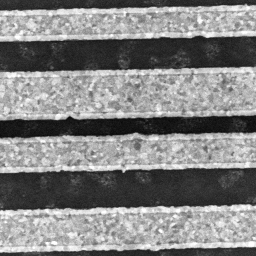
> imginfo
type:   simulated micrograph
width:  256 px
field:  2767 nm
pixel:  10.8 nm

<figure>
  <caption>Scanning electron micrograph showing one or a few lines or trenches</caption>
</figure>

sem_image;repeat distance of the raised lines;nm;740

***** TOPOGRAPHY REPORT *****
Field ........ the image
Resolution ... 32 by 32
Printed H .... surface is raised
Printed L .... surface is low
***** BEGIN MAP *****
LLLLLLLLLLLLLLLLLLLLLLLLLLLLLLLL
LLLLHLLLHHHHHHHHHHHHHHHHHHHHHHHH
HHHHHHHHHHHHHHHHHHHHHHHHHHHHHHHH
HHHHHHHHHHHHHHHHHHHHHHHHHHHHHHHH
HHHHHHHHHHHHHHHHHHLLLLLLLLLLLLLL
LLLLLLLLLLLLLLLLLLLLLLLLLLLLLLLL
LLLLLLLLLLLLLLLLLLLLLLLLLLLLLLLL
LLLLLLLLLLLLLLLLLLLLLLLLLLLLLLLL
LLLLLLLLLLLLLLLLLLLLLLLLLLLLLLLL
HHHHHHHHHHHHHHHHHHHHHHHHHHHHHHHH
HHHHHHHHHHHHHHHHHHHHHHHHHHHHHHHH
HHHHHHHHHHHHHHHHHHHHHHHHHHHHHHHH
HHHHHHHHHHHHHHHHHHHHHHHHHHHHHHHH
HHHHHHHHHHHHHHHHHHHHHHHHHHHHHHHH
HHHHHHHHLHHHHLLLLLLLLLLLLLLLLLLL
LLLLLLLLLLLLLLLLLLLLLLLLLLLLLLLL
LLLLLLLLLLLLLLLLLLLLLLLLLLLLLLLL
LLLLHHHHHHHHHHHHHHHHHHHHHHHHHHHH
HHHHHHHHHHHHHHHHHHHHHHHHHHHHHHHH
HHHHHHHHHHHHHHHHHHHHHHHHHHHHHHHH
HHHHHHHHHHHHHHHHHHHHHHHHHHHHHHHH
LLLLLLLLLLLLLLLLLLLLLLLLLLLLLLLL
LLLLLLLLLLLLLLLLLLLLLLLLLLLLLLLL
LLLLLLLLLLLLLLLLLLLLLLLLLLLLLLLL
LLLLLLLLLLLLLLLLLLLLLLLLLLLLLLLL
LLLLLLLLLLLLLLLLLLLLLLLLLLLLLLLL
LLLLHHLHHHHLHHHHHHHHHHHHHHHHHHHH
HHHHHHHHHHHHHHHHHHHHHHHHHHHHHHHH
HHHHHHHHHHHHHHHHHHHHHHHHHHHHHHHH
HHHHHHHHHHHHHHHHHHHHHHHHHHHHHHHH
HHHHHHHHHHHHHHHHHHHHHHHHHHHHHHHH
LLLLLLLLLLLLLLLLLLLLLLLLLLLLLLLL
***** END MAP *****